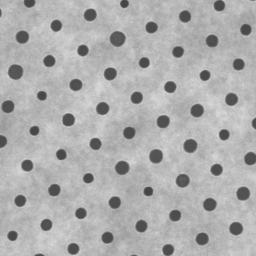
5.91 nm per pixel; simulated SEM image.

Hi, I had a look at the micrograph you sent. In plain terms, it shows a regular array of holes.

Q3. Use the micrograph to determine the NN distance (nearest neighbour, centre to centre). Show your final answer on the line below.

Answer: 0.209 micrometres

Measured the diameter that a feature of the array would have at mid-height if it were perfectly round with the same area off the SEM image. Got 75.2 nanometers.